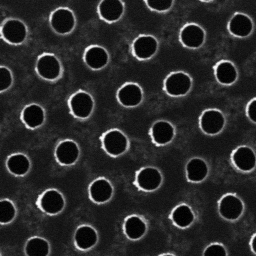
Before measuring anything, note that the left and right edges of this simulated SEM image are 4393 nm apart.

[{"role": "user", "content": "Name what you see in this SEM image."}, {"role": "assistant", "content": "a regular array of holes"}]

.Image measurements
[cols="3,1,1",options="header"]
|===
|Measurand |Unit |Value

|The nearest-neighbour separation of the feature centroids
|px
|48.7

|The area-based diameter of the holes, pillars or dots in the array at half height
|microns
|0.393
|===